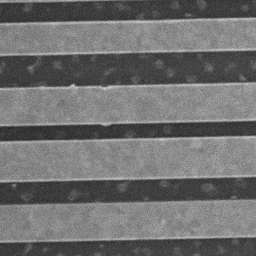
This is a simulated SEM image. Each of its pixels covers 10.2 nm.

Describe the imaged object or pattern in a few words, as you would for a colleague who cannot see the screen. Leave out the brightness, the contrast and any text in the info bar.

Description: one or a few lines or trenches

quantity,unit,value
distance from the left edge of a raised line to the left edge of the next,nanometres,623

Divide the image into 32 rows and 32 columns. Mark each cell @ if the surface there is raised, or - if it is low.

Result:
--------------------------------
--------------------------------
--------------------------@@@@@@
@@@@@@@@@@@@@@@@@@@@@@@@@@@@@@@@
@@@@@@@@@@@@@@@@@@@@@@@@@@@@@@@@
@@@@@@@@@@@@@@@@@@@@@@@@@@@@@@@@
@@@@@@@@@@@@@@@@@@@-------------
--------------------------------
--------------------------------
--------------------------------
---------------------------@@@@@
@@@@@@@@@@@@@@@@@@@@@@@@@@@@@@@@
@@@@@@@@@@@@@@@@@@@@@@@@@@@@@@@@
@@@@@@@@@@@@@@@@@@@@@@@@@@@@@@@@
@@@@@@@@@@@@@@@@@@@@@@@@@@@@@@@@
@@@@@@--------------------------
--------------------------------
----------------@@@@@@@@@@@@@@@@
@@@@@@@@@@@@@@@@@@@@@@@@@@@@@@@@
@@@@@@@@@@@@@@@@@@@@@@@@@@@@@@@@
@@@@@@@@@@@@@@@@@@@@@@@@@@@@@@@@
@@@@@@@@@@@@@@@@@@@@@@@@@@@@@@@@
@@@@@@--------------------------
--------------------------------
--------------------------------
------------@@@@@@@@@@@@@@@@@@@@
@@@@@@@@@@@@@@@@@@@@@@@@@@@@@@@@
@@@@@@@@@@@@@@@@@@@@@@@@@@@@@@@@
@@@@@@@@@@@@@@@@@@@@@@@@@@@@@@@@
@@@@@@@@@@@@@@@@@@@@@@@@@@@@@@@@
--------------------------------
--------------------------------